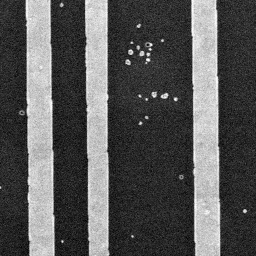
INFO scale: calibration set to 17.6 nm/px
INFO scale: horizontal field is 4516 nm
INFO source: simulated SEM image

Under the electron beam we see lines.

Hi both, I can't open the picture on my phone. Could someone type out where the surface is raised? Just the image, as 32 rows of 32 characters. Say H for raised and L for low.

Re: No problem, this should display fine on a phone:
LLLHHHLLLLLHHLLLLLLLLLLLHHHLLLLL
LLLHHHLLLLLHHLLLLLLLLLLLHHHLLLLL
LLLHHHLLLLLHHLLLLLLLLLLLHHHLLLLL
LLLHHHLLLLLHHLLLLLLLLLLLHHHLLLLL
LLLHHHLLLLLHHLLLLLLLLLLLHHHLLLLL
LLLHHHLLLLLHHLLLLLLLLLLLHHHLLLLL
LLLHHHLLLLLHHLLLLLLLLLLLHHHLLLLL
LLLHHHLLLLLHHLLLLLLLLLLLHHHLLLLL
LLLHHHLLLLLHHLLLLLLLLLLLHHHLLLLL
LLLHHHLLLLLHHLLLLLLLLLLLHHHLLLLL
LLLHHHLLLLLHHLLLLLLLLLLLHHHLLLLL
LLLHHHLLLLLHHLLLLLLLLLLLHHHLLLLL
LLLHHHLLLLLHHLLLLLLLLLLLHHHLLLLL
LLLHHHLLLLLHHLLLLLLLLLLLHHHLLLLL
LLLHHHLLLLLHHLLLLLLLLLLLHHHLLLLL
LLLLHHLLLLLHHLLLLLLLLLLLHHHLLLLL
LLLLHHLLLLLHHLLLLLLLLLLLHHHLLLLL
LLLLHHLLLLLHHLLLLLLLLLLLHHHLLLLL
LLLLHHLLLLLHHLLLLLLLLLLLHHHLLLLL
LLLLHHLLLLLHHLLLLLLLLLLLHHHLLLLL
LLLLHHHLLLLHHLLLLLLLLLLLHHHLLLLL
LLLLHHHLLLLHHLLLLLLLLLLLHHHLLLLL
LLLLHHHLLLLHHLLLLLLLLLLLHHHLLLLL
LLLLHHHLLLLHHLLLLLLLLLLLHHHLLLLL
LLLLHHHLLLLHHLLLLLLLLLLLHHHLLLLL
LLLLHHHLLLLHHLLLLLLLLLLLHHHLLLLL
LLLLHHHLLLLHHLLLLLLLLLLLHHHLLLLL
LLLLHHHLLLLHHLLLLLLLLLLLHHHLLLLL
LLLLHHHLLLLHHLLLLLLLLLLLHHHLLLLL
LLLLHHHLLLLHHLLLLLLLLLLLHHHLLLLL
LLLLHHHLLLLHHLLLLLLLLLLLHHHLLLLL
LLLLHHHLLLLHHHLLLLLLLLLLHHHLLLLL